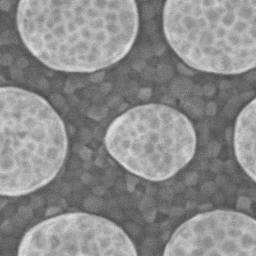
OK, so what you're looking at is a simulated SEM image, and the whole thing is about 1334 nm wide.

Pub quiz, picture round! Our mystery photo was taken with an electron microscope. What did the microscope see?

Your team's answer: raised bodies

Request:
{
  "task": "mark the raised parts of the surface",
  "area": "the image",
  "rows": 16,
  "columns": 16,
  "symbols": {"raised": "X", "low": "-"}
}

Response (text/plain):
-XXXXXXX--XXXXXX
-XXXXXXXX-XXXXXX
--XXXXXX---XXXXX
--XXXXXX---XXXXX
-------------XX-
----------------
XXX-------------
XXXX---XXXXX---X
XXXX---XXXXX---X
XXXX---XXXXX---X
XXXX----XXX----X
XXX-------------
----------------
----XX------XXX-
--XXXXXX---XXXXX
-XXXXXXX--XXXXXX